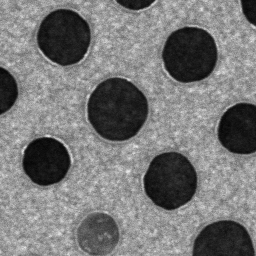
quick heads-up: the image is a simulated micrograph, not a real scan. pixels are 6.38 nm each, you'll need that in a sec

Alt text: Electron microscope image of holes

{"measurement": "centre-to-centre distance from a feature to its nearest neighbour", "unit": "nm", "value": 567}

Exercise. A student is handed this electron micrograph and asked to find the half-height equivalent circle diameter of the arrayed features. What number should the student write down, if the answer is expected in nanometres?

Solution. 355